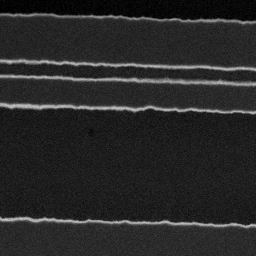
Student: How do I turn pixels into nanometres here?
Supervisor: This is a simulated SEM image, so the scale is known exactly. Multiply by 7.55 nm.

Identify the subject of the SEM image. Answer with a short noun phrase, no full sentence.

lines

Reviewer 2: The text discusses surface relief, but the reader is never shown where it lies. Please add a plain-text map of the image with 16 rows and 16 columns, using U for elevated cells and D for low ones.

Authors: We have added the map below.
DDDDDDDDDDDDDDDD
UUUUUUUUUUUUUUUU
UUUUUUUUUUUUUUUU
UUUUUUUUUUUUUUUU
UUUUUUUUUUUUUUUU
UUUUUUUUUUUUUUUU
UUUUUUUUUUUUUUUU
DDDDDDDDDDDDDDDD
DDDDDDDDDDDDDDDD
DDDDDDDDDDDDDDDD
DDDDDDDDDDDDDDDD
DDDDDDDDDDDDDDDD
DDDDDDDDDDDDDDDD
DDDDDDDDDDDDDDDD
UUUUUUUUUUUUUUUU
UUUUUUUUUUUUUUUU